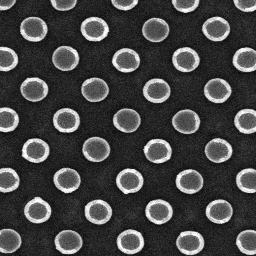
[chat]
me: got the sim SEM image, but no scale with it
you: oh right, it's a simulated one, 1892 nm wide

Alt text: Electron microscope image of a regular array of raised bodies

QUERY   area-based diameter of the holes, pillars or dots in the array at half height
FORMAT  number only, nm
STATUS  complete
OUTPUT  186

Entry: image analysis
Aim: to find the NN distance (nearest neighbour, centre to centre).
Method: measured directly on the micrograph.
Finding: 0.312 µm